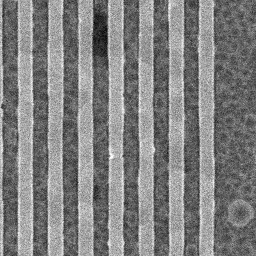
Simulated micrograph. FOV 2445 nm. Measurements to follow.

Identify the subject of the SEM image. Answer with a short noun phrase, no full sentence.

parallel lines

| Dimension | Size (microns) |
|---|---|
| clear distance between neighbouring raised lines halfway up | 0.16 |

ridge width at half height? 123 nanometers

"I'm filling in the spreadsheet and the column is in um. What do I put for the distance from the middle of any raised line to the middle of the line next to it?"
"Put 0.289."